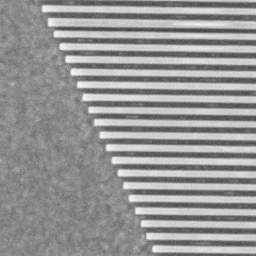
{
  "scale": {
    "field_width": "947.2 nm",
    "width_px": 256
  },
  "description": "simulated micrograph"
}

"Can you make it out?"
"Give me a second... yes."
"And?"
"parallel lines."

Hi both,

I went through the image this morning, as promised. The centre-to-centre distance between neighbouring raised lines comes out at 0.0465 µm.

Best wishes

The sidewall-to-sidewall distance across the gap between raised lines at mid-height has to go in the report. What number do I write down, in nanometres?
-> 25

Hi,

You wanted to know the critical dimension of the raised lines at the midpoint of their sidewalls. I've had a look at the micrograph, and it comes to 21.7 nanometers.